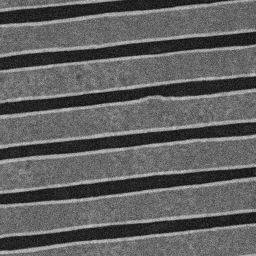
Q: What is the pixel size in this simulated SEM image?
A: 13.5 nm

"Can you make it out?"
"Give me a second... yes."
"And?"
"parallel lines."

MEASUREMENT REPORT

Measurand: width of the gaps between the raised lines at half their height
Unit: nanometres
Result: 207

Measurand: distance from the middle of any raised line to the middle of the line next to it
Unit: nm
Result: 607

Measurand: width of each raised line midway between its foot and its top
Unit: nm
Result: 402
